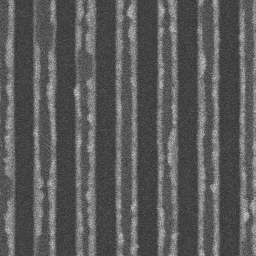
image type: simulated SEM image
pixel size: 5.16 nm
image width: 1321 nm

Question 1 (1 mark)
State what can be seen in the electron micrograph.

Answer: parallel lines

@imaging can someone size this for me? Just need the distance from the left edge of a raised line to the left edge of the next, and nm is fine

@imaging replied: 211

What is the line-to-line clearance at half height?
110 nm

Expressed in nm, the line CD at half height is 105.